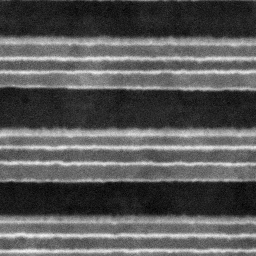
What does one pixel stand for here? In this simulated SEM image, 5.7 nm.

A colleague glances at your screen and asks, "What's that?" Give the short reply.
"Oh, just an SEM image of lines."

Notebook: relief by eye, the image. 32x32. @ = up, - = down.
--------------------------------
--------------------------------
--------------------------------
--------------------------------
--------------------------------
@@@@@@@@@@@@@@@@@@@@@@@@@@@@@@@@
@@@@@@@@@@@@@@@@@@@@@@@@@@@@@@@@
@@@@@@@@@@@@@@@@@@@@@@@@@@@@@@@@
@@@@@@@@@@@@@@@@@@@@@@@@@@@@@@@@
@@@@@@@@@@@@@@@@@@@@@@@@@@@@@@@@
@@@@@@@@@@@@@@@@@@@@@@@@@@@@@@@@
--------------------------------
--------------------------------
--------------------------------
--------------------------------
--------------------------------
--------------------------------
@@@@@@@@@@@@@@@@@@@@@@@@@@@@@@@@
@@@@@@@@@@@@@@@@@@@@@@@@@@@@@@@@
@@@@@@@@@@@@@@@@@@@@@@@@@@@@@@@@
@@@@@@@@@@@@@@@@@@@@@@@@@@@@@@@@
@@@@@@@@@@@@@@@@@@@@@@@@@@@@@@@@
@@@@@@@@@@@@@@@@@@@@@@@@@@@@@@@@
--------------------------------
--------------------------------
--------------------------------
--------------------------------
--------------------------------
@@@@@@@@@@@@@@@@@@@@@@@@@@@@@@@@
@@@@@@@@@@@@@@@@@@@@@@@@@@@@@@@@
@@@@@@@@@@@@@@@@@@@@@@@@@@@@@@@@
@@@@@@@@@@@@@@@@@@@@@@@@@@@@@@@@